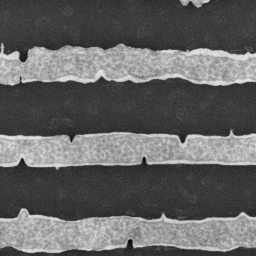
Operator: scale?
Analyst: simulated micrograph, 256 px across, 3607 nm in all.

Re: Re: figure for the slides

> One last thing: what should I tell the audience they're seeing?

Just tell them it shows one or a few lines or trenches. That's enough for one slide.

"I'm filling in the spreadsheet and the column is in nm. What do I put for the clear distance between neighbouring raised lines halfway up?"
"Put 773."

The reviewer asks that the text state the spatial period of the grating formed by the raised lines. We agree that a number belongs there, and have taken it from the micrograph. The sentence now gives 1.18 um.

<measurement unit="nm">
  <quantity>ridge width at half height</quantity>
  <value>412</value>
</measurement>